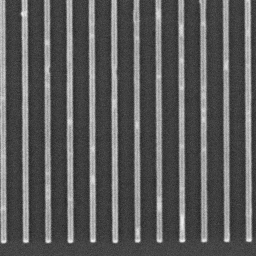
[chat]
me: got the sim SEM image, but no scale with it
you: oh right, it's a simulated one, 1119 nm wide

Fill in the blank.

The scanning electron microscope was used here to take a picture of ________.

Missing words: parallel lines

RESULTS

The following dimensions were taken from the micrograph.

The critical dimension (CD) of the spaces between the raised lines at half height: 75.9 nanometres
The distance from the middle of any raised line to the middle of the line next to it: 22.3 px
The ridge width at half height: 0.0197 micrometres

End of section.